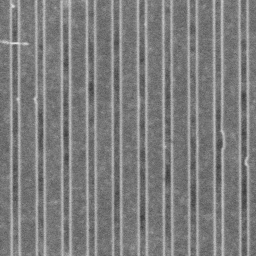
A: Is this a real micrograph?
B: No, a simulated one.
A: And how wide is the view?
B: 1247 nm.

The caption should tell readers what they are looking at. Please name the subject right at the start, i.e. parallel lines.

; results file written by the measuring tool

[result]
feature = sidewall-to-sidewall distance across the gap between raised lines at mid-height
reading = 34.1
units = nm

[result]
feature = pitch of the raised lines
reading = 0.124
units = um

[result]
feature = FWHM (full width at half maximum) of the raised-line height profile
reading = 0.0876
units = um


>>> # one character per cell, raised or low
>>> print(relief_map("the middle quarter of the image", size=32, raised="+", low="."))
.+++++..++++..+++++..++++..++++.
.+++++..++++..+++++..++++..++++.
.+++++..++++..+++++..++++..++++.
.+++++..++++..+++++..++++..++++.
.+++++..++++..+++++..++++..++++.
.+++++..++++..+++++..++++..++++.
.+++++..++++..+++++..++++..++++.
.+++++..++++..+++++..++++..++++.
.+++++..++++..+++++..++++..++++.
.+++++..++++..+++++..++++..++++.
.+++++..++++..+++++..++++..++++.
.+++++..++++..+++++..++++..++++.
.+++++..++++..+++++..++++..++++.
.+++++..++++..+++++..++++..++++.
.+++++..++++..+++++..++++..++++.
.+++++..++++..+++++..++++..++++.
.+++++..++++..+++++..++++..++++.
.+++++..++++..+++++..++++..++++.
.+++++..++++..+++++..++++..++++.
.+++++..++++..+++++..++++..++++.
.+++++..++++..+++++..++++..++++.
.+++++..++++..+++++..++++..++++.
.+++++..++++..+++++..++++..++++.
.+++++..++++..+++++..++++..++++.
.+++++..++++..+++++..++++..++++.
.+++++..++++..+++++..++++..++++.
.+++++..++++..+++++..++++..++++.
.+++++..++++..+++++..++++..++++.
.+++++..++++..+++++..++++..++++.
..++++..++++..+++++..++++..++++.
.+++++..++++..+++++..++++..++++.
.+++++..++++..+++++..++++..++++.